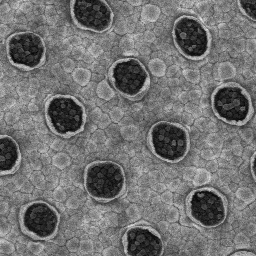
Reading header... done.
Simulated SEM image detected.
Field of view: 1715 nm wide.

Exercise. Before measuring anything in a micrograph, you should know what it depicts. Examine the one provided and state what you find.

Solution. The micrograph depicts a regular array of raised bodies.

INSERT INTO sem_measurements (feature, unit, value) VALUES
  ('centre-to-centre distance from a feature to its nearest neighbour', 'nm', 501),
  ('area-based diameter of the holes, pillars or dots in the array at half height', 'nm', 269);